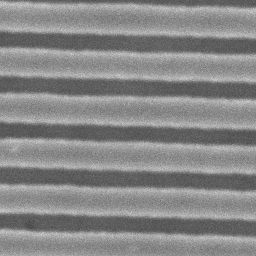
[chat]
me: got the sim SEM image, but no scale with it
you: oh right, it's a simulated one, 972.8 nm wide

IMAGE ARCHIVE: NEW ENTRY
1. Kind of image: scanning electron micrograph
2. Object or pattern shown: lines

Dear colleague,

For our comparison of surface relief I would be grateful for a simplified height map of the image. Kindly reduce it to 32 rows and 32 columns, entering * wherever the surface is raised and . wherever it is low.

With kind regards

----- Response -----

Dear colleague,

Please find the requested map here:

*******...*..*..................
********************************
********************************
********************************
...........................*****
................................
************....................
********************************
********************************
.....***************************
................................
................................
*****************************...
********************************
********************************
............********************
................................
*******.........................
********************************
********************************
********************************
.........................*******
................................
************....................
********************************
********************************
********************************
................................
................................
************************........
********************************
********************************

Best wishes